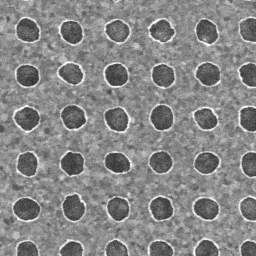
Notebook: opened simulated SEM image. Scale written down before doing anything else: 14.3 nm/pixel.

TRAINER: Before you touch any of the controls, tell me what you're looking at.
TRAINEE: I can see a regular array of holes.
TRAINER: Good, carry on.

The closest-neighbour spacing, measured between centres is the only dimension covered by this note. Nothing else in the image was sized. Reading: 43.5 px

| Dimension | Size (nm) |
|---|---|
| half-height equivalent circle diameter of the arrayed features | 340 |